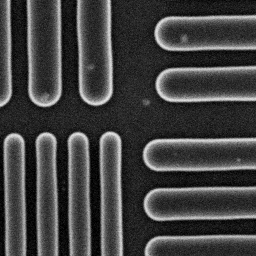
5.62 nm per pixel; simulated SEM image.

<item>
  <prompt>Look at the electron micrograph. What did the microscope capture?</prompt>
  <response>groups of lines, slits or small figures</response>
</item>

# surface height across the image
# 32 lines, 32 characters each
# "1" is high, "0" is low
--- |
10011110001111000000000000000000
10001110001111000000000000000000
10001110001111000000111111111111
10001110001111000000111111111111
10001110001111000001111111111111
10001110001111000000111111111111
10001110001111000000000000000000
10001110001111000000000000000000
10001110001111000000000000000011
10001110001111000000111111111111
10001111001111000000111111111111
10001111001111000000111111111111
10001110000110000000011100000000
00000000000000000000000000000000
00000000000000000000000000000000
00000000000000000000000000000000
00000000000000000000000000000000
01100110011001100000000000011111
01100110011001100011111111111111
01100110011001100011111111111111
01100110011001100011111111111111
01100110011001100000000000000000
01100110011001100000000000000000
01100110011001100000000000000001
01100110011001100011111111111111
01100110011001100011111111111111
01100110011001100011111111111111
01100110011001100000000000000000
01100110011001100000000000000000
01100110011001100000000000000000
01100110011001100001111111111111
01100110011001100011111111111111